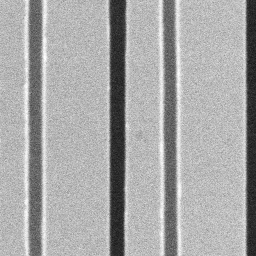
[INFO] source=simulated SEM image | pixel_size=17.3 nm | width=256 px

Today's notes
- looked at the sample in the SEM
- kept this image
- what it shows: lines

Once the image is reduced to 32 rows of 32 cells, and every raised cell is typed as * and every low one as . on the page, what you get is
***..********...****..*********.
***..********...****..*********.
***..********...****..*********.
***..*********..****..*********.
***..*********..****..*********.
***..*********..****..*********.
***..*********..****..*********.
***..*********..****..*********.
***..*********..****..*********.
***..*********..****..*********.
***..*********..****..*********.
***..*********..****..*********.
***..*********..****..*********.
***..*********..****..*********.
***..*********..****..*********.
***..*********..****..*********.
***..*********..****..*********.
***..*********..****..*********.
***..*********..****..*********.
***..*********..****..*********.
***..*********..****..*********.
***..*********..****..*********.
***..*********..****..*********.
***..*********..****..*********.
***..*********..****..*********.
***..*********..****..*********.
***..*********..****..*********.
***..*********..****..*********.
***..*********..****..*********.
***..*********..****..*********.
***..*********..****..*********.
***..*********..****..*********.